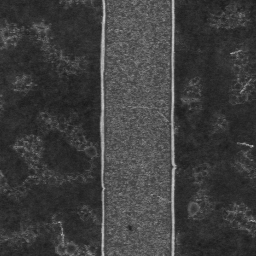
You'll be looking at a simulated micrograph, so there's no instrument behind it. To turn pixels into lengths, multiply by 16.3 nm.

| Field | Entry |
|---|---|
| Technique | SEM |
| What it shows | one or a few lines or trenches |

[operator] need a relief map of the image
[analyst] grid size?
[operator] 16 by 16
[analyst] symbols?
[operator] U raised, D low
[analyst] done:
UUUUUUUDDDDUUUUU
UUUUUUDDDDDUUUUU
UUUUUUDDDDDUUUUU
UUUUUUDDDDDUUUUU
UUUUUUDDDDDUUUUU
UUUUUUDDDDDUUUUU
UUUUUUDDDDDUUUUU
UUUUUUDDDDDUUUUU
UUUUUUDDDDDUUUUU
UUUUUUDDDDDUUUUU
UUUUUUDDDDDUUUUU
UUUUUUDDDDDUUUUU
UUUUUUDDDDDUUUUU
UUUUUUDDDDDUUUUU
UUUUUUDDDDDUUUUU
UUUUUUDDDDDUUUUU